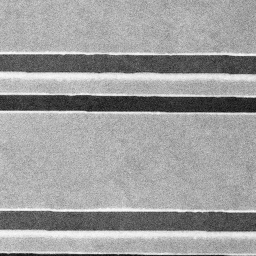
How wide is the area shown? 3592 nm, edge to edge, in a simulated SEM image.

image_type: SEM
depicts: lines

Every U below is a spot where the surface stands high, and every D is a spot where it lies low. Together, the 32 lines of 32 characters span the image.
UUUUUUUUUUUUUUUUUUUUUUUUUUUUUUUU
UUUUUUUUUUUUUUUUUUUUUUUUUUUUUUUU
UUUUUUUUUUUUUUUUUUUUUUUUUUUUUUUU
UUUUUUUUUUUUUUUUUUUUUUUUUUUUUUUU
UUUUUUUUUUUUUUUUUUUUUUUUUUUUUUUU
UUUUUUUUUUUUUUUUUUUUUUUUUUUUUUUU
UUUUUUUUUUUUUUUUUUUUUUUUUUUUUUUU
DDDDDDDDDDDDDDDDDDDDDDDDDDDDDDDD
DDDDDDDDDDDDDDDDDDDDDDDDDDDDDDDD
UUUUUUUUUUUUUUUUUUUUUUUUUUUUUUUU
UUUUUUUUUUUUUUUUUUUUUUUUUUUUUUUU
UUUUUUUUUUUUUUUUUUUUUUUUUUUUUUUU
DDDDDDDDDDDDDDDDDDDDDDDDDDDDDDDD
DDDDDDDDDDDDDDDDDDDDDDDDDDDDDDDD
UUUUUUUUUUUUUUUUUUUUUUUUUUUUUUUU
UUUUUUUUUUUUUUUUUUUUUUUUUUUUUUUU
UUUUUUUUUUUUUUUUUUUUUUUUUUUUUUUU
UUUUUUUUUUUUUUUUUUUUUUUUUUUUUUUU
UUUUUUUUUUUUUUUUUUUUUUUUUUUUUUUU
UUUUUUUUUUUUUUUUUUUUUUUUUUUUUUUU
UUUUUUUUUUUUUUUUUUUUUUUUUUUUUUUU
UUUUUUUUUUUUUUUUUUUUUUUUUUUUUUUU
UUUUUUUUUUUUUUUUUUUUUUUUUUUUUUUU
UUUUUUUUUUUUUUUUUUUUUUUUUUUUUUUU
UUUUUUUUUUUUUUUUUUUUUUUUUUUUUUUU
UUUUUUUUUUUUUUUUUUUUUUUUUUUUUUUU
DDDDDDDDDDDDDDDDDDDDDDDDDDDDDDDD
DDDDDDDDDDDDDDDDDDDDDDDDDDDDDDDD
DDDDDDDDDDDDDDDDDDDDDDDDDDDDDDDD
UUUUUUUUUUUUUUUUUUUUUUUUUUUUUUUU
UUUUUUUUUUUUUUUUUUUUUUUUUUUUUUUU
UUUUUUUUUUUUUUUUUUUUUUUUUUUUUUUU